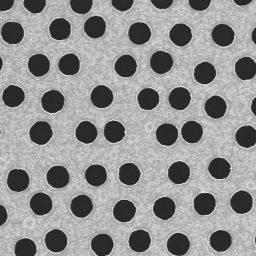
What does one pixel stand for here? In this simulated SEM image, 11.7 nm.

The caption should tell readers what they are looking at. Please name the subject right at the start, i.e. a regular array of holes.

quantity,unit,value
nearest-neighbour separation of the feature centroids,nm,396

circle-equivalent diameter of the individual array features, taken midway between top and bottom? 0.263 microns